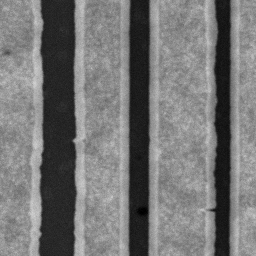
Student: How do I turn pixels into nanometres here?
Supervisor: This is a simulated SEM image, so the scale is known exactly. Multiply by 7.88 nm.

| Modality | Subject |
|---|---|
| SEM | one or a few lines or trenches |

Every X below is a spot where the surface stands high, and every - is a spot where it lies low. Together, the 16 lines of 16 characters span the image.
XX---XXX--XXX--X
XX---XXX--XXX--X
XX---XXX--XXX--X
XX---XXX--XXX--X
XX---XXX--XXX--X
XX---XXX--XXX--X
XX---XXX--XXX--X
XX---XXX--XXX--X
XX---XXX--XXX--X
XX---XXX--XXX--X
XX---XXX--XXX--X
XX---XXX--XXX--X
XX---XXX--XXX--X
XX---XXX--XXX--X
XX---XXX--XXX--X
XX---XXX--XXX--X